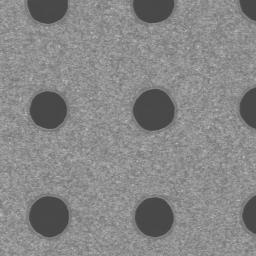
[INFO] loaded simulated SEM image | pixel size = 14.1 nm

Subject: holes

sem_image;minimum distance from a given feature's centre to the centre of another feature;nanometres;1480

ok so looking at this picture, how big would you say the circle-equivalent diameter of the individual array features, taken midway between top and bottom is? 0.561 µm